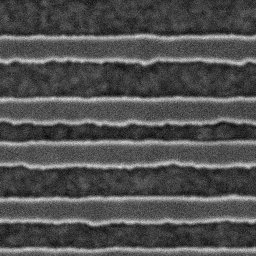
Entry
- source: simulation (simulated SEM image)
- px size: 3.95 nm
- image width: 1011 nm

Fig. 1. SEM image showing lines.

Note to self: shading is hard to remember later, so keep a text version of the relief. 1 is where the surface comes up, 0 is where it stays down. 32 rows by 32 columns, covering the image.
00000000000000000000000000000000
00000000000000000000000000000000
00000000000000000000000000000000
00000000000000000000000000000000
00000000000000001110000000001100
11111111111111111111111111111111
11111111111111111111111111111111
11111111111111111111111111111111
00000000000000000000000000000000
00000000000000000000000000000000
00000000000000000000000000000000
00000000000000000000000000000000
11111111111111111111111111111111
11111111111111111111111111111111
11111111111111111111111111111111
00001110110011110111111111100001
00000000000000000000000001000000
00000000000000000000000001010000
11111111111111111111111111111111
11111111111111111111111111111111
11111111111111111111101111111111
00000000000000000000000000000000
00000000000000000000000000000000
00000000000000000000000000000000
00000000000000000000000000000000
11111111111111111111111111111111
11111111111111111111111111111111
11111111111111111111111111111111
00000000000000000000000000000000
00000000000000000000000000000000
00000000000000000000000000000000
11111111111111111111111111111111